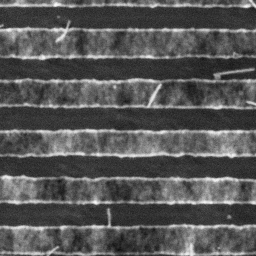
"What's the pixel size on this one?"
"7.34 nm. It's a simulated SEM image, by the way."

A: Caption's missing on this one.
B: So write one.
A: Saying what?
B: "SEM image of lines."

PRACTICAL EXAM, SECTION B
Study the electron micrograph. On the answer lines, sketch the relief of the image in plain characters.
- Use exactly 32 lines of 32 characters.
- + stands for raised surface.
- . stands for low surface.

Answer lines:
++++++++++++++++++++++++++++++++
................................
................................
........+.......................
++++++++++++++++++++++++++++++++
++++++++++++++++++++++++++++++++
++++++++++++++++++++++++++++++++
................................
................................
................................
++++++++++++++++++++++++++++++++
++++++++++++++++++++++++++++++++
++++++++++++++++++++++++++++++++
..........................++.+++
................................
................................
++++++++++++++++++++++++++++++++
++++++++++++++++++++++++++++++++
++++++++++++++++++++++++++++++++
+++++++.......+++++..++.++++++++
................................
................................
++++++++++++++++++++++++++++++++
++++++++++++++++++++++++++++++++
++++++++++++++++++++++++++++++++
................................
................................
................................
++++++++++++++++++++++++++++++++
++++++++++++++++++++++++++++++++
++++++++++++++++++++++++++++++++
++++++++++++++++++++++++++++++++